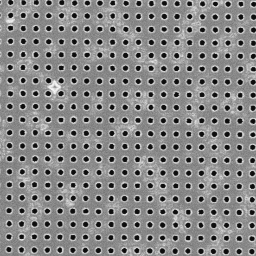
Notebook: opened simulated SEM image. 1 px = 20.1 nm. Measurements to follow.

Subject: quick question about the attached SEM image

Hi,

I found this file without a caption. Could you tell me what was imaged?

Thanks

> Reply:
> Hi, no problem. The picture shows a regular array of holes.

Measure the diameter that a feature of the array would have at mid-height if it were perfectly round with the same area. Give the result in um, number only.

0.106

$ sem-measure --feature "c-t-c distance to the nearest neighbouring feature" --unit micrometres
0.253